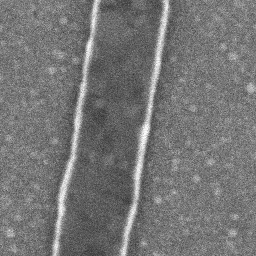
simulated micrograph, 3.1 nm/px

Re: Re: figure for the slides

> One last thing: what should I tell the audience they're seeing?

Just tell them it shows one or a few lines or trenches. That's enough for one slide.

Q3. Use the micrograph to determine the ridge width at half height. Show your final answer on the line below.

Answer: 0.217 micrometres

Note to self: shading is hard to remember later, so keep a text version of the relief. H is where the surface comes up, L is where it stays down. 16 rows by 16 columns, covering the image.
LLLLLLHHHHLLLLLL
LLLLLLHHHHLLLLLL
LLLLLLHHHHLLLLLL
LLLLLHHHHHLLLLLL
LLLLLHHHHHLLLLLL
LLLLLHHHHHLLLLLL
LLLLLHHHHLLLLLLL
LLLLLHHHHLLLLLLL
LLLLLHHHHLLLLLLL
LLLLLHHHHLLLLLLL
LLLLHHHHHLLLLLLL
LLLLHHHHHLLLLLLL
LLLLHHHHLLLLLLLL
LLLLHHHHLLLLLLLL
LLLLHHHHLLLLLLLL
LLLHHHHHLLLLLLLL